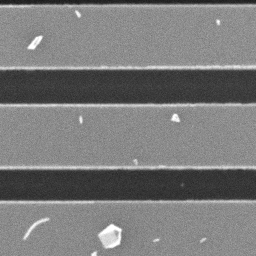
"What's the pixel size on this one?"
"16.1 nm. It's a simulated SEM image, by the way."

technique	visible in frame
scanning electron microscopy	lines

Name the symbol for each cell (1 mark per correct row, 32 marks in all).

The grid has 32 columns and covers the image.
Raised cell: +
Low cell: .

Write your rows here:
................................
++++++++++++++++++++++++++++++++
++++++++++++++++++++++++++++++++
++++++++++++++++++++++++++++++++
++++++++++++++++++++++++++++++++
++++++++++++++++++++++++++++++++
++++++++++++++++++++++++++++++++
++++++++++++++++++++++++++++++++
++++++++++++++++++++++++++++++++
................................
................................
................................
................................
++++++++++++++++++++++++++++++++
++++++++++++++++++++++++++++++++
++++++++++++++++++++++++++++++++
++++++++++++++++++++++++++++++++
++++++++++++++++++++++++++++++++
++++++++++++++++++++++++++++++++
++++++++++++++++++++++++++++++++
++++++++++++++++++++++++++++++++
................................
................................
................................
................................
++++++++++++++++++++++++++++++++
++++++++++++++++++++++++++++++++
++++++++++++++++++++++++++++++++
++++++++++++++++++++++++++++++++
++++++++++++++++++++++++++++++++
++++++++++++++++++++++++++++++++
++++++++++++++++++++++++++++++++